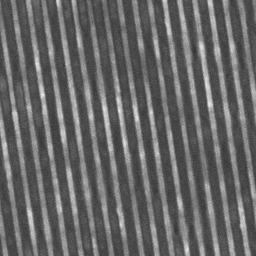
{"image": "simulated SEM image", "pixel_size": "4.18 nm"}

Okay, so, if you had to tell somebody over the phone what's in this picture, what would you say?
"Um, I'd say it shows parallel lines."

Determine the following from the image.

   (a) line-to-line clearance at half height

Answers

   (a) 44.4 nanometres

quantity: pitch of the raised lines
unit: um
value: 0.0626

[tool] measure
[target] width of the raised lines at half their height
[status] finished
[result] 18 nanometers